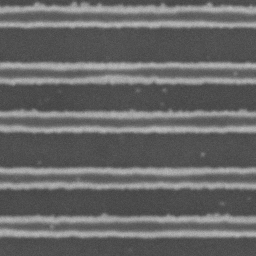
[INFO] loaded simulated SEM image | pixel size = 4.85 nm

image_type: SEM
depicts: lines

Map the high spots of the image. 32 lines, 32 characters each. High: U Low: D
DDDDDDDDDDDDDDDDDDDDDDDDDDDDDDDD
UUUUUUUUUUUUUUUUUUUUUUUUUUUUUUUU
UUUUUUUUUUUUUUUUUUUUUUUUUUUUUUUU
DDDDDDDDDDDDDDDDDDDDDDDDDDDDDDDD
DDDDDDDDDDDDDDDDDDDDDDDDDDDDDDDD
DDDDDDDDDDDDDDDDDDDDDDDDDDDDDDDD
DDDDDDDDDDDDDDDDDDDDDDDDDDDDDDDD
DDDDDDDDDDDDDDDDDDDDDDDDDDDDDDDD
UUUUUUUUUUUUUUUUUUUUUUUUUUUUUUUU
UUUUUUUUUUUUUUUUUUUUUUUUUUUUUUUU
DDDDDDDDDDDDDDDDDDDDDDDDDDDDDDDD
DDDDDDDDDDDDDDDDDDDDDDDDDDDDDDDD
DDDDDDDDDDDDDDDDDDDDDDDDDDDDDDDD
DDDDDDDDDDDDDDDDDDDDDDDDDDDDDDDD
UUUUUUUUUUUUUUUUUUUUUUUUUUUUUUUU
UUUUUUUUUUUUUUUUUUUUUUUUUUUUUUUU
DDDDDDDDDDDDDDDDDDDDDDDDDDDDDDDD
DDDDDDDDDDDDDDDDDDDDDDDDDDDDDDDD
DDDDDDDDDDDDDDDDDDDDDDDDDDDDDDDD
DDDDDDDDDDDDDDDDDDDDDDDDDDDDDDDD
DDDDDDDDDDDDDDDDDDDDDDDDDDDDDDDD
UUUUUUUUUUUUUUUUUUUUUUUUUUUUUUUU
UUUUUUUUUUUUUUUUUUUUUUUUUUUUUUUU
DDDDDDDDDDDDDDDDDDDDDDDDDDDDDDDD
DDDDDDDDDDDDDDDDDDDDDDDDDDDDDDDD
DDDDDDDDDDDDDDDDDDDDDDDDDDDDDDDD
DDDDDDDDDDDDDDDDDDDDDDDDDDDDDDDD
UUUUUUUUUUUUUUUUUUUUUUUUUUUUUUUU
UUUUUUUUUUUUUUUUUUUUUUUUUUUUUUUU
DDDDDDDDDDDDDDDDDDDDDDDDDDDDDDDD
DDDDDDDDDDDDDDDDDDDDDDDDDDDDDDDD
DDDDDDDDDDDDDDDDDDDDDDDDDDDDDDDD